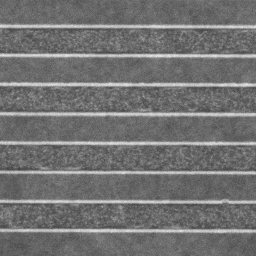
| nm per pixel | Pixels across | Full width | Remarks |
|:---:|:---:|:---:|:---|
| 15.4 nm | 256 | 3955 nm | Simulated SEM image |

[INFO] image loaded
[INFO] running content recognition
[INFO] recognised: parallel lines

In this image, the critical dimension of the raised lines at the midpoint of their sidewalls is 460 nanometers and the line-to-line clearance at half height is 444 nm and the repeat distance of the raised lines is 902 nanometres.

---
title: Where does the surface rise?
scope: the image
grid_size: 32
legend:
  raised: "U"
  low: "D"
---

UUUUUUUUUUUUUUUUUUUUUUUUUUUUUUUU
UUUUUUUUUUUUUUUUUUUUUUUUUUUUUUUU
UUUUUUUUUUUUUUUUUUUUUUUUUUUUUUUU
DDDDDDDDDDDDDDDDDDDDDDDDDDDDDDDD
DDDDDDDDDDDDDDDDDDDDDDDDDDDDDDDD
DDDDDDDDDDDDDDDDDDDDDDDDDDDDDDDD
DDDDDDDDDDDDDDDDDDDDDDDDDDDDDDDD
UUUUUUUUUUUUUUUUUUUUUUUUUUUUUUUU
UUUUUUUUUUUUUUUUUUUUUUUUUUUUUUUU
UUUUUUUUUUUUUUUUUUUUUUUUUUUUUUUU
DDUUUUUUUUUUUUUUUUUUUUUUUUUUUUUU
DDDDDDDDDDDDDDDDDDDDDDDDDDDDDDDD
DDDDDDDDDDDDDDDDDDDDDDDDDDDDDDDD
DDDDDDDDDDDDDDDDDDDDDDDDDDDDDDDD
UUUUUUUUUUUUUUUUUUUUUUUUUUUUUUUU
UUUUUUUUUUUUUUUUUUUUUUUUUUUUUUUU
UUUUUUUUUUUUUUUUUUUUUUUUUUUUUUUU
UUUUUUUUUUUUUUUUUUUUUUUUUUUUUUUU
DDDDDDDDDDDDDDDDDDDDDDDDDDDDDDDD
DDDDDDDDDDDDDDDDDDDDDDDDDDDDDDDD
DDDDDDDDDDDDDDDDDDDDDDDDDDDDDDDD
DDDDDDDDDDDDDDDDDDDDDDDDDDDDDDDD
UUUUUUUUUUUUUUUUUUUUUUUUUUUUUUUU
UUUUUUUUUUUUUUUUUUUUUUUUUUUUUUUU
UUUUUUUUUUUUUUUUUUUUUUUUUUUUUUUU
DDDDDDDDDDDDDDDDDDDDDDDDDDDDDDDD
DDDDDDDDDDDDDDDDDDDDDDDDDDDDDDDD
DDDDDDDDDDDDDDDDDDDDDDDDDDDDDDDD
DDDDDDDDDDDDDDDDDDDDDDDDDDDDDDDD
UUUUUUUUUUUUUUUUUUUUUUUUUUUUUUUU
UUUUUUUUUUUUUUUUUUUUUUUUUUUUUUUU
UUUUUUUUUUUUUUUUUUUUUUUUUUUUUUUU